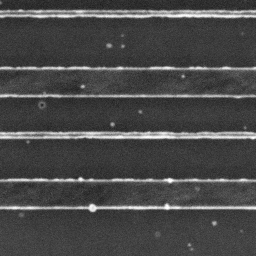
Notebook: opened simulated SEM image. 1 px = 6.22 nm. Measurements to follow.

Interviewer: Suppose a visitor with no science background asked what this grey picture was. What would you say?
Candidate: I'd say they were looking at lines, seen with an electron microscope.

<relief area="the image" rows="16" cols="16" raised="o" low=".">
................
................
................
................
oooooooooooooooo
oooooooooooooooo
................
................
................
................
................
oooooooooooooooo
oooooooooooooooo
................
................
................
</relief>